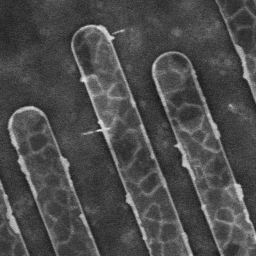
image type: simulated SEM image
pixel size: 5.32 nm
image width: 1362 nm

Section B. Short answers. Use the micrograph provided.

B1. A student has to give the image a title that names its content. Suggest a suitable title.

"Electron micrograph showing one or a few lines or trenches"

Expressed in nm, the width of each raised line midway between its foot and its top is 209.